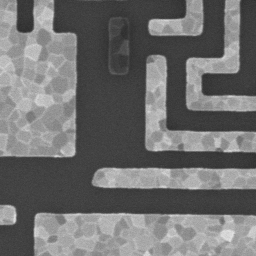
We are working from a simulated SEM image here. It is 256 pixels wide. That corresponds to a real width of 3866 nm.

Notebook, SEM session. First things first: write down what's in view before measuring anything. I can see wiring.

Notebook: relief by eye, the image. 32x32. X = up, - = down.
XX--XXX----------------XX---XX--
XX--XXX----------------XX---XX--
XX--XXX-------XX---XXXXXX---XX--
XX--XXX-------XX---XXXXXX---XX--
XXXXXXXXX-----XX------------XX--
XXXXXXXXX-----XX------------XX--
XXXXXXXXX-----XX------------XX--
XXXXXXXXX-----XX--XXX---XXXXXX--
XXXXXXXXX-----XX--XXX--XXXXXXX--
XXXXXXXXX---------XXX--XX-------
XXXXXXXXX---------XXX--XX-------
XXXXXXXXX---------XXX--XX-------
XXXXXXXXX---------XXX--XXXXXXXXX
XXXXXXXXX---------XXX---XXXXXXXX
XXXXXXXXX---------XXX-----------
XXXXXXXXX---------XXX-----------
XXXXXXXXX---------XXXXXX--------
XXXXXXXXX---------XXXXXXXXXXXXXX
XXXXXXXXX---------XXXXXXXXXXXXXX
XXXXXXXXX-----------------------
--------------------------------
------------XXXXXXXXXXXXXXXXXXXX
------------XXXXXXXXXXXXXXXXXXXX
-----------------------XXXXX----
--------------------------------
--------------------------------
XX------------------------------
XX--XXXXXXXXXXXXXXXXXXXXXXXXXXXX
----XXXXXXXXXXXXXXXXXXXXXXXXXXXX
----XXXXXXXXXXXXXXXXXXXXXXXXXXXX
----XXXXXXXXXXXXXXXXXXXXXXXXXXXX
----XXXXXXXXXXXXXXXXXXXXXXXXXXXX